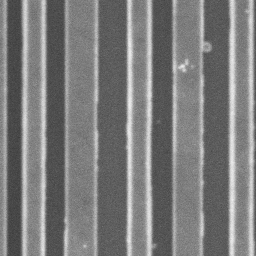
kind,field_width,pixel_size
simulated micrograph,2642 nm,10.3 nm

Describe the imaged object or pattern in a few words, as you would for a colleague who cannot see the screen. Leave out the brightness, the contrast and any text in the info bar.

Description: lines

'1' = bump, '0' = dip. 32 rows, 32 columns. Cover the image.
10011100111100001110001110000111
10011100111100001110001110000111
10011100111100001110001110000111
10011100111100001110001110000111
10011100111100001110001110000111
10011100111100001110001110000111
10011100111100001110001110000111
10011100111100001110001110000111
10011100111100001110001110000111
10011100111100001110001110000111
10011100111100001110001110000111
10011100111100001110001110000111
10011100111100001110001110000111
10011100111100001110001110000111
10011100111100001110001110000111
10011100111100001110001110000111
10011100111100001110001110000111
10011100111100001110001110000111
10011100111100001110001110000111
10011100111100001110001110000111
10011100111100001110001110000111
10011100111100001110001110000111
10011100111100001110001110000111
10011100111100001110001110000111
10011100111100001110001110000111
10011100111100001110001110000111
10011000111100001110001110000111
10011000111100001110001110000111
10011100111100001110001110000111
10011100111100001110001110000111
10011100111100001110001110000111
10011100111100001110001110000111